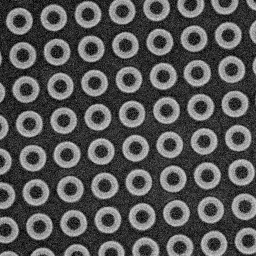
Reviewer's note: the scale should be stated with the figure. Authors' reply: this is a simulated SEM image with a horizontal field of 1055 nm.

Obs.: an array of small figures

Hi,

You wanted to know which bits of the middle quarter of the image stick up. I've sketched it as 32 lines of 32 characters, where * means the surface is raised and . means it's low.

................*......****....*
..............****....******..**
.....*****...******...******..**
**...******..******...******..**
**..*******..******...******...*
**...******..******....****.....
**...*****....****..............
**....***.......................
.........................*......
....*...........**.....*****...*
.......***.....*****...******..*
**....*****...******..*******..*
***..*******..******..*******..*
***..*******..******...*****....
***..*******..******....***.....
***...*****.....**..............
**......*.......................
.........................***....
................****....*****...
*......*****...******..*******..
***...******...******..*******..
****..******...******..******...
****..******...******...*****...
****..******....****.....*......
***....****.............**......
***.*...........................
**.***............**.....*****..
*..***...***....*****...******..
***.....*****...******..*******.
****...******...******..******..
*****..******...******..******..
*****..******...*****....****...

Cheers